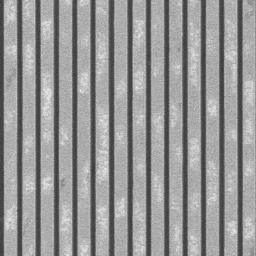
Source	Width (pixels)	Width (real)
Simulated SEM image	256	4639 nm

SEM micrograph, parallel lines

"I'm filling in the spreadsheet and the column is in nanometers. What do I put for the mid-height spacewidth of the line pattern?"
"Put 86.1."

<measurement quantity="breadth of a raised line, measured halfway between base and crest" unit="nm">240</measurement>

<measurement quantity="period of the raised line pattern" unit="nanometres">332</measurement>